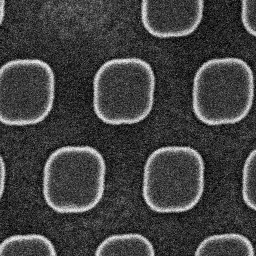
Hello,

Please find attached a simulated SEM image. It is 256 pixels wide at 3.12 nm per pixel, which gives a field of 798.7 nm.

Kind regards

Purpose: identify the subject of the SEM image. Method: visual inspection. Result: raised bodies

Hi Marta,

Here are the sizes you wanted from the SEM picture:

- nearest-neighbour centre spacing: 0.31 µm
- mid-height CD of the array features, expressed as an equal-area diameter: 64.3 pixels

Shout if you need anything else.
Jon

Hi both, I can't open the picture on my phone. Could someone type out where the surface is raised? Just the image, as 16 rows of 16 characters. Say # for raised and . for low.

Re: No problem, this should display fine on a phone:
.........####..#
.........###...#
................
................
###...###...####
###...####..####
###...###...####
##.....##....##.
................
....##....##....
...###...####..#
...###...####..#
...###...###...#
................
................
###...###...####